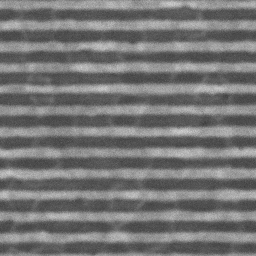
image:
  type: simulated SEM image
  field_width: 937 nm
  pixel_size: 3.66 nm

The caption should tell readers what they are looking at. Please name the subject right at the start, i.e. parallel lines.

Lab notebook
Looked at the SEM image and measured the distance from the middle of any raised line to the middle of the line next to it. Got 77.5 nanometres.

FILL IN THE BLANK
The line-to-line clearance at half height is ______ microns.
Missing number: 0.0507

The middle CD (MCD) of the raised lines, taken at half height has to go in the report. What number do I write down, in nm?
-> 27